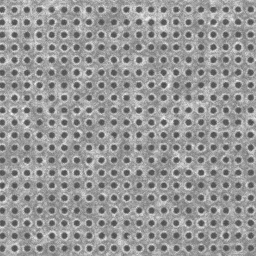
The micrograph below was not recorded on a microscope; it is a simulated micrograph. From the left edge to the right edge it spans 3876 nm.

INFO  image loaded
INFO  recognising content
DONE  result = a regular array of holes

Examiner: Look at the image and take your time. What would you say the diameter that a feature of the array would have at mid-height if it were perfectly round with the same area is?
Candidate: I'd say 105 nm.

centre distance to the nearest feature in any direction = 182 nm